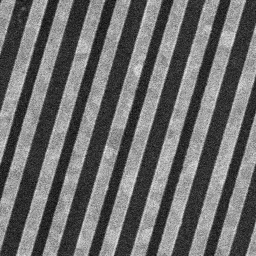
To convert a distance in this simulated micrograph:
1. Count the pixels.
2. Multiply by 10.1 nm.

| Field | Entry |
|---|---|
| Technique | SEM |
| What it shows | parallel lines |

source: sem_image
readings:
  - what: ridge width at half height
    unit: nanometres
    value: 128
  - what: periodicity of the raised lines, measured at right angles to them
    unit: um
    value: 0.276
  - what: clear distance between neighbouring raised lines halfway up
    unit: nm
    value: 173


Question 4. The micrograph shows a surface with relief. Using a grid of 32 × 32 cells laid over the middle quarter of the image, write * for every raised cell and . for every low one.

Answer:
..***...****....****...***.....*
..***...***.....***...****....**
.****...***.....***...***.....**
.***....***.....***...***.....**
.***...***.....***....***.....**
.***...***.....***...****....***
****...***.....***...***.....***
***....***....****...***.....***
***...****....***...****....****
***...***.....***...***.....***.
**....***....****...***.....***.
**...****....***....***.....***.
**...***.....***...****....****.
**...***.....***...***.....***..
*...****....****...***.....***..
*...****....***...****....****..
*...***.....***...***.....***...
...****....****...***.....***...
...****....***....***.....***...
...***.....***...***.....***....
...***.....***...***.....***...*
..****....****...***.....***...*
..***.....***...****....****...*
..***.....***...***.....***...**
..***....****...***.....***...**
.****....***...****....****...**
.***.....***...***.....***....**
.***.....***...***.....***...***
****....***....***.....***...***
***.....***...****....****...***
***.....***...***.....***...****
***....****...***.....***...***.